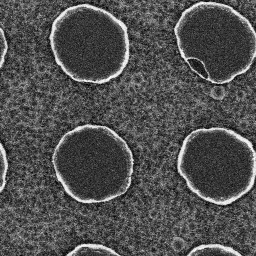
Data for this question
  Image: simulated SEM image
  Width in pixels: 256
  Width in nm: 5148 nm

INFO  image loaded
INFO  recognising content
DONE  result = raised bodies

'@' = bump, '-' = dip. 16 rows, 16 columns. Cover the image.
-----@------@@--
---@@@@@---@@@@@
---@@@@@---@@@@@
---@@@@@----@@@@
----@@@------@@-
----------------
----------------
----------------
----@@@-----@@@-
---@@@@@---@@@@@
---@@@@@---@@@@@
----@@@@----@@@@
-----@@------@@-
----------------
----------------
-----@@-----@@--